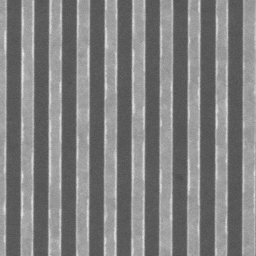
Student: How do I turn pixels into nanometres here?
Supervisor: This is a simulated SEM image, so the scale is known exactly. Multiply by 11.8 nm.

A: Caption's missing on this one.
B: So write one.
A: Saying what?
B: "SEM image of parallel lines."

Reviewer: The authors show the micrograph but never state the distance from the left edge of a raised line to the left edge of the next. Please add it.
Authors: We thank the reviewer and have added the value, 328 nanometers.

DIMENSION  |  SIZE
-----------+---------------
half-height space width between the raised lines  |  188 nanometers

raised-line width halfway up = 140 nanometers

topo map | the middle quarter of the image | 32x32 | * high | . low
...***....***....***....***....*
...***....***....***....***....*
...***....***....***....***....*
...***....***....***....***....*
...***....***....***....***....*
...***....***....***....***....*
...***....***....***....***....*
...***....***....***....***....*
...***....***....***....***....*
...***....***....***....***....*
...***....***....***....***....*
...***....***....***....***....*
...***....***.....**....***....*
...***....***....***....***....*
...***....***....***....***....*
...***....***....***....***....*
...***....***....***....***....*
...***....***....***....***....*
...***....***....***....***....*
...***....***....***....***....*
...***....*.*....***....***....*
...***....*.*....***....***....*
...***....***....***....***....*
...***....***....***....***....*
...***....***....***....***....*
...***....***....***....***....*
...***....***....***....***....*
...***....***....***....***....*
...***....***....***....***....*
...***....***....***....***....*
...***....***....***....***....*
...***....***....***....***....*